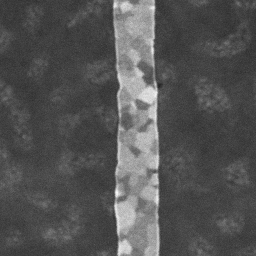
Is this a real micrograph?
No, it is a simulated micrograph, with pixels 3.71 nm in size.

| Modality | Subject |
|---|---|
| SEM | one or a few lines or trenches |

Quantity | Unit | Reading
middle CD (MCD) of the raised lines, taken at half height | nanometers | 146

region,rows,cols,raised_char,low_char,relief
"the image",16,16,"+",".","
.......+++......
.......+++......
.......+++......
.......+++......
.......+++......
.......+++......
.......+++......
.......+++......
.......+++......
.......+++......
.......+++......
.......+++......
.......+++......
.......+++......
.......+++......
.......+++......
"